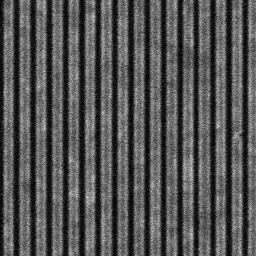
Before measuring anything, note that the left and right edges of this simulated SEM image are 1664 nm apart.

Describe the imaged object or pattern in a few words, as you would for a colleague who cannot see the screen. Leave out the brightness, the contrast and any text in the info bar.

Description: parallel lines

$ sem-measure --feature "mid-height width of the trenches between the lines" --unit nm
51.2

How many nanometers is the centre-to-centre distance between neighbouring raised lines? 106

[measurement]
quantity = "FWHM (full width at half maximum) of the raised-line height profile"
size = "7.88 px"